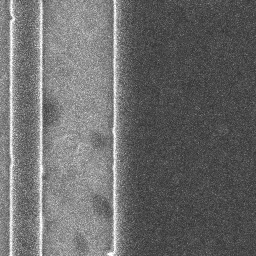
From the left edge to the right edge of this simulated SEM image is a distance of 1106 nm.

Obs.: one or a few lines or trenches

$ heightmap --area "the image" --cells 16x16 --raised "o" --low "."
.oo....ooooooooo
.oo....ooooooooo
.oo....ooooooooo
.oo....ooooooooo
.oo....ooooooooo
.oo....ooooooooo
.oo....ooooooooo
.oo....ooooooooo
.oo....ooooooooo
.oo....ooooooooo
.oo....ooooooooo
.oo....ooooooooo
.oo....ooooooooo
.oo....ooooooooo
.oo....ooooooooo
.oo....ooooooooo